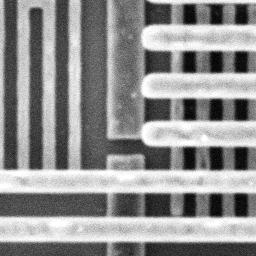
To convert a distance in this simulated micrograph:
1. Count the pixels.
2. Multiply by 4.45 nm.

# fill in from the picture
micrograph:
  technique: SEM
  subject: wiring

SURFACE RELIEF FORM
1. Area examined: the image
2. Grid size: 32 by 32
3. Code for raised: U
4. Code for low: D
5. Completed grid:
DDDDDDDDDDDDDDDDDDDDDDDDDDDDDDDD
DDDDDDDDDDDDDDDDDDDDDDDDDDDDDDDD
DDDDDDDDDDDDDDDDDDDDDDDDDDDDDDDD
DDDDDDDDDDDDDDDDDDUUUUUUUUUUUUUU
DDDDDDDDDDDDDDDDDDUUUUUUUUUUUUUU
DDDDDDDDDDDDDDDDDDUUUUUUUUUUUUUU
DDDDDDDDDDDDDDDDDDDDDDDDDDDDDDDD
DDDDDDDDDDDDDDDDDDDDDDDDDDDDDDDD
DDDDDDDDDDDDDDDDDDDDDDDDDDDDDDDD
DDDDDDDDDDDDDDDDDDUUUUUUUUUUUUUU
DDDDDDDDDDDDDDDDDDUUUUUUUUUUUUUU
DDDDDDDDDDDDDDDDDDUUUUUUUUUUUUUU
DDDDDDDDDDDDDDDDDDDDDDDDDDDDDDDD
DDDDDDDDDDDDDDDDDDDDDDDDDDDDDDDD
DDDDDDDDDDDDDDDDDDDDDDDDDDDDDDDD
DDDDDDDDDDDDDDDDDDUUUUUUUUUUUUUU
DDDDDDDDDDDDDDDDDDUUUUUUUUUUUUUU
DDDDDDDDDDDDDDDDDDUUUUUUUUUUUUUU
DDDDDDDDDDDDDDDDDDDDDDDDDDDDDDDD
DDDDDDDDDDDDDDDDDDDDDDDDDDDDDDDD
DDDDDDDDDDDDDDDDDDDDDDDDDDDDDDDD
UUUUUUUUUUUUUUUUUUUUUUUUUUUUUUUU
UUUUUUUUUUUUUUUUUUUUUUUUUUUUUUUU
UUUUUUUUUUUUUUUUUUUUUUUUUUUUUUUU
DDDDDDDDDDDDDDDDDDDDDDDDDDDDDDDD
DDDDDDDDDDDDDDDDDDDDDDDDDDDDDDDD
DDDDDDDDDDDDDDDDDDDDDDDDDDDDDDDD
UUUUUUUUUUUUUUUUUUUUUUUUUUUUUUUU
UUUUUUUUUUUUUUUUUUUUUUUUUUUUUUUU
UUUUUUUUUUUUUUUUUUUUUUUUUUUUUUUU
DDDDDDDDDDDDDDDDDDDDDDDDDDDDDDDD
DDDDDDDDDDDDDDDDDDDDDDDDDDDDDDDD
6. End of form